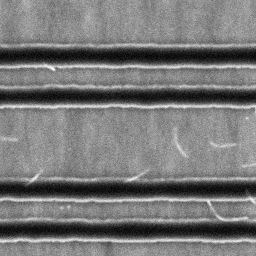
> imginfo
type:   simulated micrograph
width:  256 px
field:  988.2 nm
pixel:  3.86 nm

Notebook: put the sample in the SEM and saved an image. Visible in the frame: lines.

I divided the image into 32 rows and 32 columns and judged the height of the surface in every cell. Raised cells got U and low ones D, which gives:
DDDDDDDDDDDDDDDDDDDDDDDDDDDDDDDD
DDDDDDDDDDDDDDDDDDDDDDDDDDDDDDDD
DDDDDDDDDDDDDDDDDDDDDDDDDDDDDDDD
DDDDDDDDDDDDDDDDDDDDDDDDDDDDDDDD
DDDDDDDDDDDDDDDDDDDDDDDDDDDDDDDD
DDDDDDDDDDDDDDDDDDDDDDDDDDDDDDDD
UUUUUUUUUUUUUUUUUUUUUUUUUUUUUUUU
UUUUUUUUUUUUUUUUUUUUUUUUUUUUUUUU
DDDDDDUDDDDDDDDDDDDDDDDDDDDDDDDD
DDDDDDDDDDDDDDDDDDDDDDDDDDDDDDDD
DDDDDDDDDDDDDDDDDDDDDDDDDDDDDDDD
UUUUUUUUUUUUUUUUUUUUUUUUUUUUUUUU
UUUUUUUUUUUUUUUUUUUUUUUUUUUUUUUU
DDDDDDDDDDDDDDDDDDDDDDDDDDDDDDDD
DDDDDDDDDDDDDDDDDDDDDDDDDDDDDDDD
DDDDDDDDDDDDDDDDDDDDDDDDDDDDDDDD
DDDDDDDDDDDDDDDDDDDDDDDDDDDDDDDD
DDDDDDDDDDDDDDDDDDDDDDDDDDDDDDDD
DDDDDDDDDDDDDDDDDDDDDDDDDDDDDDDD
DDDDDDDDDDDDDDDDDDDDDDDDDDDDDDDD
DDDDDDDDDDDDDDDDDDDDDDDDDDDDDDDD
DDDDDDDDDDDDDDDDDDDDDDDDDDDDDDDD
UUUUUUUUUUUUUUUUUUUUUUUUUUUUUUUU
UUUUUUUUUUUUUUUUUUUUUUUUUUUUUUUU
UUUUUUUUUUUUUUUUUUUUUUUUUUUUUUUU
DDDDDDDDDDDDDDDDDDDDDDDDDDDDDDDD
DDDDDDDDDDDDDDDDDDDDDDDDDDDDDDDD
DUUUUUUDUUUDDDDUUUUUDDDDDUDUUUUD
UUUUUUUUUUUUUUUUUUUUUUUUUUUUUUUU
UUUUUUUUUUUUUUUUUUUUUUUUUUUUUUUU
DDDDDDDDDDDDDDDDDDDDDDDDDDDDDDDD
DDDDDDDDDDDDDDDDDDDDDDDDDDDDDDDD